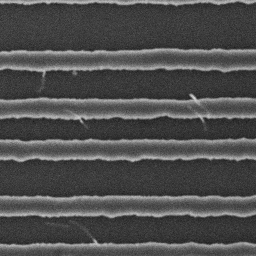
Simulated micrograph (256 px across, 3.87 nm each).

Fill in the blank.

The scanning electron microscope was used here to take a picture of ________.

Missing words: lines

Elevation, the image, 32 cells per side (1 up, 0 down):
00000000000000010000011000000000
00000000000000000000000000000000
00000000000000000000000000000000
00000000000000000000000000000000
00000000000000000000000000000000
00000000000000000000000000000000
11111111111111111111111111111111
11111111111111111111111111111111
11111111111111111111111111111111
00000000000000000000000000000000
00000000000000000000000000000000
00000000000000000000000000000000
11111111111111111111110111111111
11111111111111111111111111111111
11111111111111111111011111111111
00000000000000000000000000000000
00000000000000000000000000000000
00000000000100000000000000001111
11111111111111111111111111111111
11111111111111111111111111111111
00000000000000000000000000000000
00000000000000000000000000000000
00000000000000000000000000000000
00000000000000000000000000000000
00000000000000000000000000000000
11111111111111111111111111111111
11111111111111111111111111111111
00000000000000000000000000000000
00000000000000000000000000000000
00000000000000000000000000000000
00001101000111000111100110000111
11111111111111111111111111111111